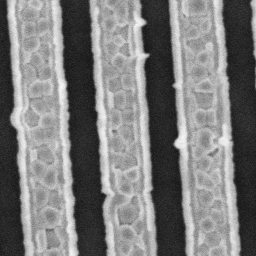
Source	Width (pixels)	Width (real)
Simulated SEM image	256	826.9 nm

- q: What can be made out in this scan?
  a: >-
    one or a few lines or trenches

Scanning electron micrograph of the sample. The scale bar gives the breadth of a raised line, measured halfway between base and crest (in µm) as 0.152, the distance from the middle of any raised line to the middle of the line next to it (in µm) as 0.261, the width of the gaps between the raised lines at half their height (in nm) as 109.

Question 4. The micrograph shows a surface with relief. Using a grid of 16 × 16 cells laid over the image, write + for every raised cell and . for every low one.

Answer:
.+++..+++..+++..
.+++..+++..+++..
.+++..+++..+++..
.+++..+++..+++..
.+++..+++..+++..
.+++..+++..+++..
.+++..+++..+++..
.+++..+++..+++..
.+++..+++..+++..
.+++..+++..+++..
.+++..+++..+++..
.+++...++...++..
.+++...++...+++.
..++...++...+++.
..+++..+++..+++.
..+++..+++..+++.